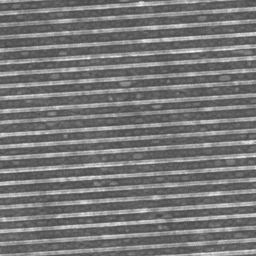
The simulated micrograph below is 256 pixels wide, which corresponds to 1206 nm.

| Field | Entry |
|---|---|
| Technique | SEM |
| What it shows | parallel lines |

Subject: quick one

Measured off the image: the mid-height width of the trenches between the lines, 43.5 nanometres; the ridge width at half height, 14.7 nm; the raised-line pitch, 57.2 nanometers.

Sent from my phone